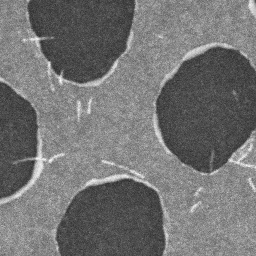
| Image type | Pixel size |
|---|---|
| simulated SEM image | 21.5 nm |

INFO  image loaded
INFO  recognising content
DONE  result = holes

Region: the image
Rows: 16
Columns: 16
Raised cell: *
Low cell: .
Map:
**......********
**......********
**......********
***.....****...*
***....****.....
.*********......
..********......
..********......
..********......
..*********....*
..**********..**
..****...*******
****......******
****......******
***.......******
****......******